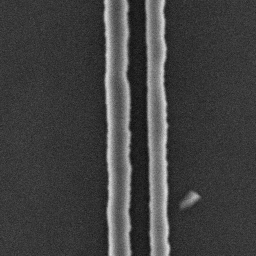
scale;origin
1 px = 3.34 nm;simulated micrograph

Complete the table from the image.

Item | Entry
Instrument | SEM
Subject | lines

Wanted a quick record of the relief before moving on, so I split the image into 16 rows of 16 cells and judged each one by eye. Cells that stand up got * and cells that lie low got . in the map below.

.......***......
.......***......
.......***......
.......***......
.......***......
.......***......
.......***......
.......***......
.......***......
.......***......
.......***......
.......***......
.......***......
.......***......
.......****.....
.......****.....